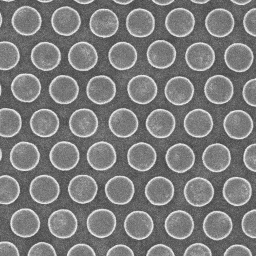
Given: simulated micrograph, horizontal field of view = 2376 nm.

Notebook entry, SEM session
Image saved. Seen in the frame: a regular array of raised bodies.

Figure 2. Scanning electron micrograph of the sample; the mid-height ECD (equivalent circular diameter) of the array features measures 0.258 microns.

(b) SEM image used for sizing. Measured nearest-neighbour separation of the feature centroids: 0.348 micrometres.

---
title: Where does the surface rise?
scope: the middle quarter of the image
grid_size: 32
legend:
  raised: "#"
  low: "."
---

..#####.....#####......###.....#
................................
................................
##.....####.......####......##..
###...######.....#####....######
###...#######...#######...######
###...#######...#######..#######
###...######....#######..#######
###...######.....#####....######
#.......###.......###......####.
................................
....##........##........#.......
..######....#####.....#####....#
..######...#######...######...##
.#######...#######...#######..##
.#######...#######...#######..##
..######....######...######....#
...####......####.....#####....#
................................
................................
###....#####.....#####.....####.
###...######....######....######
####..#######...#######...######
####..#######...#######...######
###...#######...#######...######
###....#####.....#####....######
...................#.......####.
................................
...####......###.......##.......
..######...######....######....#
.#######...######....######....#
.#######...######....######...##